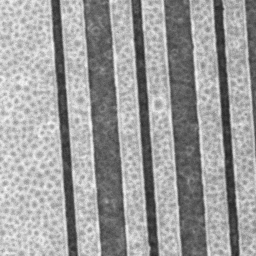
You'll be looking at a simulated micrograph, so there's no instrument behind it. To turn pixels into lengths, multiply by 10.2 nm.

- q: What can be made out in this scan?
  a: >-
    parallel lines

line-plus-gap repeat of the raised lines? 422 nm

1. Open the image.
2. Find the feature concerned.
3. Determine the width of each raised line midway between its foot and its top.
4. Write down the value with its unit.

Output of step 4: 21.6 pixels